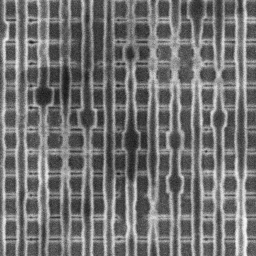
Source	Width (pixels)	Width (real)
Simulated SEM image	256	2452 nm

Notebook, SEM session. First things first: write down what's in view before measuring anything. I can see wiring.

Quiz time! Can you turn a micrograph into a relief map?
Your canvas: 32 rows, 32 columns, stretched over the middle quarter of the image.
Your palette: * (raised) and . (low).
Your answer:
*....**...**....**...**....*....
**...**...**....**...**....*....
**...**...***...**....*....*....
**...**...***...**....*....*....
**...**...***...**...**....*....
**..***...***...**...**....**...
**..***...***...**...**....**...
**..***...***...**...**....**...
**..***...***...**...**....**...
*...***...***...**...**....**...
*....**...**....**...**....**...
*...****..**....**...**....**...
*...****..**....**...**....**...
*...****..***...**...**....**...
*...****..***..***...**....**...
*...****..***..***...**....**...
*....**...***..***...**....**...
*....**...***..****..**...****..
*....**...***..****..**...****..
*....**...***..****..**...****..
*....**...***..****..**...****..
*....**...***..****..**....**...
*....**...***..***...***...**...
*....**...***...**...***...**...
*....**...***...**...***...**...
*....**...***...**...***...**...
*....**...***..***...**....**...
*....**...***..***...**...***...
*....**...***..***...**...****..
*....**...***...**...**...****..
*....**...***...**...**...****..
**...**...***...**...**...****..